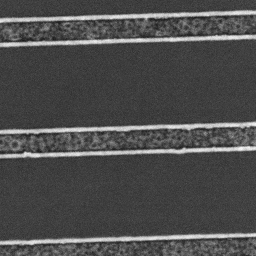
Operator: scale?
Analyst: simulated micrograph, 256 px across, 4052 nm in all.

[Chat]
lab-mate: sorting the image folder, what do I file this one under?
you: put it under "one or a few lines or trenches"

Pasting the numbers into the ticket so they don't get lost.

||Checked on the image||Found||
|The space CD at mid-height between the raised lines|1.37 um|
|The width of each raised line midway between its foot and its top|378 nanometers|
